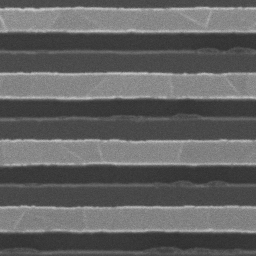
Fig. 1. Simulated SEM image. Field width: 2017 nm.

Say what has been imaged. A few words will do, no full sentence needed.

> lines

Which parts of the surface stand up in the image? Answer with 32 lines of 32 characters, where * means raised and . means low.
********************************
********************************
********************************
********************************
................................
................................
....***......*..........********
********************************
********************************
********************************
********************************
********************************
................................
................................
..............****....***.......
********************************
********************************
********************************
********************************
********************************
************..******************
................................
................................
********************************
********************************
********************************
********************************
********************************
********************************
................................
................................
*****.....*......**************.